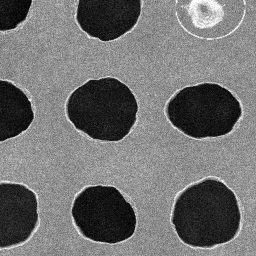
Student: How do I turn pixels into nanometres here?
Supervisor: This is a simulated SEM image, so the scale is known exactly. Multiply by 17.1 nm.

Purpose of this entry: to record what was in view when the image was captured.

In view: holes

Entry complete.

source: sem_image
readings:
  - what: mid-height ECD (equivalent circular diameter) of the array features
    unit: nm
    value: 1110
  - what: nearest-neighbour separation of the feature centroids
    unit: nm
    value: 1740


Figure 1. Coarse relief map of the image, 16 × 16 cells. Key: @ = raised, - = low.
--@@@----@@@@@@@
-@@@@---@@@@@@@@
@@@@@@-@@@@@@@@@
@@@@@@@@@@@@@@@@
@@@@@@@@@@@@@@@@
-@@@@---@@@@--@@
--@@-----@@----@
--@@----@@@----@
-@@@@@--@@@@--@@
@@@@@@@@@@@@@@@@
@@@@@@@@@@@@@@@@
-@@@@@@@@@@@--@@
--@@@---@@@----@
--@@@---@@@----@
--@@@---@@@----@
@@@@@@@@@@@@@@@@